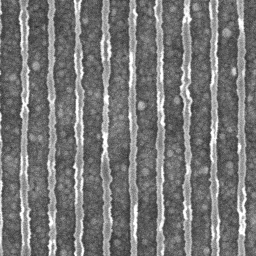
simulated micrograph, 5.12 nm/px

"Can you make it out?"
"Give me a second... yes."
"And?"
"parallel lines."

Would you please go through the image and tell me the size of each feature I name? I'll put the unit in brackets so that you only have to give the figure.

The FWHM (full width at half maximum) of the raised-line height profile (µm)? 0.0365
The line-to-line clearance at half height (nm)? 101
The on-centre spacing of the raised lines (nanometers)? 139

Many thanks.